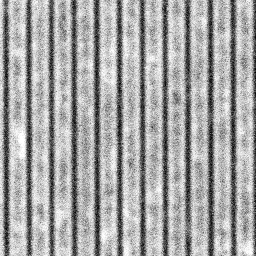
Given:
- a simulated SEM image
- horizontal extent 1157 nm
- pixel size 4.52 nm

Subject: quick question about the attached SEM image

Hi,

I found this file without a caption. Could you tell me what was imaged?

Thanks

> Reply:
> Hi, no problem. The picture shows parallel lines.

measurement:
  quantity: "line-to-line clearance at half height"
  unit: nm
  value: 35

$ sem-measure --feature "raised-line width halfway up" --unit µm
0.0667